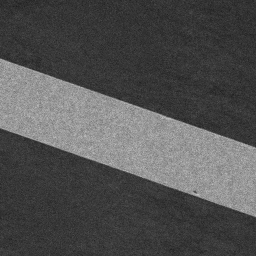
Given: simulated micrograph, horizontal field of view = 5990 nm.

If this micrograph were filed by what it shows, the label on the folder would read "one or a few lines or trenches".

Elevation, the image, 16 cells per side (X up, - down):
----------------
----------------
----------------
----------------
XX--------------
XXXXX-----------
XXXXXXXX--------
XXXXXXXXXXX-----
--XXXXXXXXXXX---
----XXXXXXXXXXXX
-------XXXXXXXXX
----------XXXXXX
-------------XXX
----------------
----------------
----------------